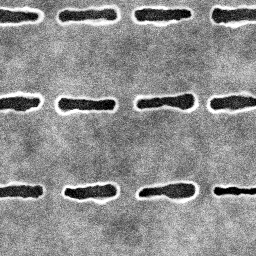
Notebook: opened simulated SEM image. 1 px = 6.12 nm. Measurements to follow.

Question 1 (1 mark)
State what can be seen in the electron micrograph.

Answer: holes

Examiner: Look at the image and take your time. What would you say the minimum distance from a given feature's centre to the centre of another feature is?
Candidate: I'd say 479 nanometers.